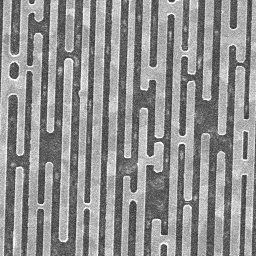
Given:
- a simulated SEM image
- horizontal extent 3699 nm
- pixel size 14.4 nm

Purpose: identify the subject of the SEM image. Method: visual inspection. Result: parallel lines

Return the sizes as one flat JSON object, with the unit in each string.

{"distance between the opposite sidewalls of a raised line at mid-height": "110 nm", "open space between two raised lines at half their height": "7.63 px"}